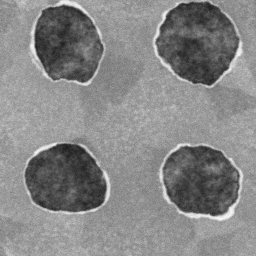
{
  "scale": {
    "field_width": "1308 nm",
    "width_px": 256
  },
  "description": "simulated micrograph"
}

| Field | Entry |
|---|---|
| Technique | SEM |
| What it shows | holes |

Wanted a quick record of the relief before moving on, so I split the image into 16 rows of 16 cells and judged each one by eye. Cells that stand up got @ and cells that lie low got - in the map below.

@@@--@@@@@@---@@
@@----@@@@-----@
@@----@@@@-----@
@@----@@@@-----@
@@@---@@@@@---@@
@@@@@@@@@@@@@@@@
@@@@@@@@@@@@@@@@
@@@@@@@@@@@@@@@@
@@@@@@@@@@@@@@@@
@@----@@@@@---@@
@@----@@@@-----@
@@-----@@@-----@
@@-----@@@@----@
@@@@@@@@@@@@@-@@
@@@@@@@@@@@@@@@@
@@@@@@@@@@@@@@@@